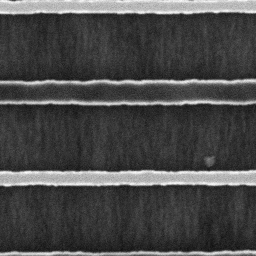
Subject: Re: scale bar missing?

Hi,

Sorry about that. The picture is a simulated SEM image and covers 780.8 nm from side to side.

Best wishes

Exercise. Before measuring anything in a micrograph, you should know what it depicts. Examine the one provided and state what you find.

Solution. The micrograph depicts lines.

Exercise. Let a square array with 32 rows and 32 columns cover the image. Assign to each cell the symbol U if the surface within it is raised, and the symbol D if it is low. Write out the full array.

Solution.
UUUUUUUUUUUUUUUUUUUUUUUUUUUUUUUU
UUUUUUUUUUUUUUUUUUUUUUUUUDUDDDUU
DDDDDDDDDDDDDDDDDDDDDDDDDDDDDDDD
DDDDDDDDDDDDDDDDDDDDDDDDDDDDDDDD
DDDDDDDDDDDDDDDDDDDDDDDDDDDDDDDD
DDDDDDDDDDDDDDDDDDDDDDDDDDDDDDDD
DDDDDDDDDDDDDDDDDDDDDDDDDDDDDDDD
DDDDDDDDDDDDDDDDDDDDDDDDDDDDDDDD
DDDDDDDDDDDDDDDDDDDDDDDDDDDDDDDD
DDDDDDDDDDDDDDDDDDDDDDDDDDDDDDDD
UUUUUUUUUUUUUUUUUUUUUUUUUUUUUUUU
UUUUUUUUUUUUUUUUUUUUUUUUUUUUUUUU
UUUUUUUUUUUUUUUUUUUUUUUUUUUUUUUU
DDDDDDDDDDDDDDDDDDDDDDDDDDDDDDDD
DDDDDDDDDDDDDDDDDDDDDDDDDDDDDDDD
DDDDDDDDDDDDDDDDDDDDDDDDDDDDDDDD
DDDDDDDDDDDDDDDDDDDDDDDDDDDDDDDD
DDDDDDDDDDDDDDDDDDDDDDDDDDDDDDDD
DDDDDDDDDDDDDDDDDDDDDDDDDDDDDDDD
DDDDDDDDDDDDDDDDDDDDDDDDDDDDDDDD
DDDDDDDDDDDDDDDDDDDDDDDDDDDDDDDD
UUDUUUUUUUUUDDDUUUUUUDUUUUUUUUUU
UUUUUUUUUUUUUUUUUUUUUUUUUUUUUUUU
DDDDDDDDDDDDDDDDDDDDDDDDDDDDDDDD
DDDDDDDDDDDDDDDDDDDDDDDDDDDDDDDD
DDDDDDDDDDDDDDDDDDDDDDDDDDDDDDDD
DDDDDDDDDDDDDDDDDDDDDDDDDDDDDDDD
DDDDDDDDDDDDDDDDDDDDDDDDDDDDDDDD
DDDDDDDDDDDDDDDDDDDDDDDDDDDDDDDD
DDDDDDDDDDDDDDDDDDDDDDDDDDDDDDDD
DDDDDDDDDDDDDDDDDDDDDDDDDDDDDDDD
DDDDDDDDDDDDDDDDDDDDDDDDDDDDUDUU